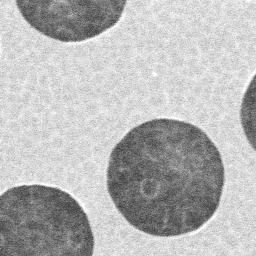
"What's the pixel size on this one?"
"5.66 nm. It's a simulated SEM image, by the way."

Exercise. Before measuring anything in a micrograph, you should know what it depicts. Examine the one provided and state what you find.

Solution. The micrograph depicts holes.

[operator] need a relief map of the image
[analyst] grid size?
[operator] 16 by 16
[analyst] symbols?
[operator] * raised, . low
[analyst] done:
*.......********
**.....*********
***..***********
****************
****************
***************.
***************.
*********..****.
********.....**.
*******.......**
*******.......**
*******.......**
.....**.......**
.....***.....***
......***...****
......**********